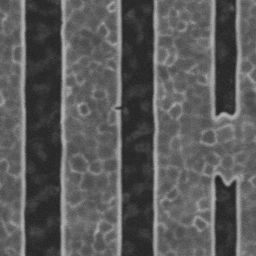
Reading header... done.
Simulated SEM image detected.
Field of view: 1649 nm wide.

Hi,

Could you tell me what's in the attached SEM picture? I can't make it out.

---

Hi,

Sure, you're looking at one or a few lines or trenches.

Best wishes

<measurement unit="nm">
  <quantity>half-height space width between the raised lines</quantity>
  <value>230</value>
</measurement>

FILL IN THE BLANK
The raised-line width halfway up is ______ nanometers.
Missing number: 375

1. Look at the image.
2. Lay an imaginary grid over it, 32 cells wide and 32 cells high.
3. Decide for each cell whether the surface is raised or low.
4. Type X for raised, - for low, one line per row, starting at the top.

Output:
XXX-----XXXXXXX----XXXXXXXX---XX
XXX-----XXXXXXX----XXXXXXXX---XX
XXX-----XXXXXXX----XXXXXXXX---XX
XXX-----XXXXXXX----XXXXXXXX---XX
XXX-----XXXXXXX----XXXXXXXX---XX
XXX-----XXXXXXX----XXXXXXXX---XX
XXX-----XXXXXXX----XXXXXXXX---XX
XXX-----XXXXXXX----XXXXXXXX---XX
XXX-----XXXXXXX----XXXXXXXX---XX
XXX-----XXXXXXX----XXXXXXXX---XX
XXX-----XXXXXXX----XXXXXXXX---XX
XXX-----XXXXXXX----XXXXXXXX---XX
XXX-----XXXXXXX----XXXXXXXX---XX
XXX-----XXXXXXX----XXXXXXXX---XX
XXX-----XXXXXXX----XXXXXXXXXXXXX
XXX-----XXXXXXX----XXXXXXXXXXXXX
XXX-----XXXXXXX-----XXXXXXXXXXXX
XXX-----XXXXXXX----XXXXXXXXXXXXX
XXX-----XXXXXXX----XXXXXXXXXXXXX
XXX-----XXXXXXX----XXXXXXXXXXXXX
XXX-----XXXXXXX----XXXXXXXXXXXXX
XXX-----XXXXXXX----XXXXXXXXXXXXX
XXX-----XXXXXXX----XXXXXXXX-XXXX
XXX-----XXXXXXX----XXXXXXXX---XX
XXX-----XXXXXXX----XXXXXXXX---XX
XXX-----XXXXXXX----XXXXXXXX---XX
XXX-----XXXXXXX----XXXXXXXX---XX
XXX-----XXXXXXX----XXXXXXXX---XX
XXX-----XXXXXXX----XXXXXXXX---XX
XXX-----XXXXXXX----XXXXXXXX---XX
XXX-----XXXXXXX----XXXXXXXX---XX
XXX-----XXXXXXX----XXXXXXXX---XX